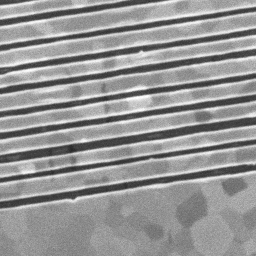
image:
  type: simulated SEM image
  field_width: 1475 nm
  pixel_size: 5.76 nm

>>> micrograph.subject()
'parallel lines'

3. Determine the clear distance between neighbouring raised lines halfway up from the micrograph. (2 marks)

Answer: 43.4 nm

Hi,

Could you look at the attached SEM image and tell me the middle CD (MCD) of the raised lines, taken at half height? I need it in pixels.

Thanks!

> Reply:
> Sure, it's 15.1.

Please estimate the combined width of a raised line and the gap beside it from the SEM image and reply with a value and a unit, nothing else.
0.127 micrometres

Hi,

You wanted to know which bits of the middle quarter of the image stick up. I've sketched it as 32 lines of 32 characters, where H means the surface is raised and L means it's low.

HHHHHHHHHHHHHHHHHHLLLLLLLLLLLLLL
HHHHHHHHHHHHLLLLLLLLLLLLLLHHHHHH
HHHHHHLLLLLLLLLLLLHHHHHHHHHHHHHH
LLLLLLLLLLLLHHHHHHHHHHHHHHHHHHHH
LLLLLLHHHHHHHHHHHHHHHHHHHHHHHHHH
HHHHHHHHHHHHHHHHHHHHHHHHLLLLLLLL
HHHHHHHHHHHHHHHHHLLLLLLLLLLLLLLH
HHHHHHHHHHHHLLLLLLLLLLLLHHHHHHHH
HHHHHHLLLLLLLLLLLHHHHHHHHHHHHHHH
LLLLLLLLLLLHHHHHHHHHHHHHHHHHHHHH
LLLLLHHHHHHHHHHHHHHHHHHHHHHLLLLL
HHHHHHHHHHHHHHHHHHHHLLLLLLLLLLLL
HHHHHHHHHHHHHHLLLLLLLLLLLLLHHHHH
HHHHHHHLLLLLLLLLLLLLLHHHHHHHHHHH
HLLLLLLLLLLLLLHHHHHHHHHHHHHHHHHH
LLLLLLLHHHHHHHHHHHHHHHHHHHHHHHLL
LHHHHHHHHHHHHHHHHHHHHHHLLLLLLLLL
HHHHHHHHHHHHHHHHHLLLLLLLLLLLLLLL
HHHHHHHHHHHHLLLLLLLLLLLLLLLLHHHH
HHHHLLLLLLLLLLLLLLLLHLHHHHHHHHHH
LLLLLLLLLLLLLLLHHHHHHHHHHHHHHHHH
LLLLLLLLHHHHHHHHHHHHHHHHHHHHLLLL
LLHHHHHHHHHHHHHHHHHHHHLLLLLLLLLL
HHHHHHHHHHHHHHHLLLLLLLLLLLLHHHHH
HHHHHHHHLLLLLLLLLLLHHHHHHHHHHHHH
HLLLLLLLLLLLLLHHHHHHHHHHHHHHHHHH
LLLLLLLHHHHHHHHHHHHHHHHHHHHHHHHH
HHHHHHHHHHHHHHHHHHHHHHHHHHHHLLLL
HHHHHHHHHHHHHHHHHHHHHLLLLLLLLLLL
HHHHHHHHHHHHHHHLLLLLLLLLLLLLHHHH
HHHHHHHHLLLLLLLLLLLLLHHHHHHHHHHH
HLLLLLLLLLLLLLLLHHHHHHHLLHHHHHHH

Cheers